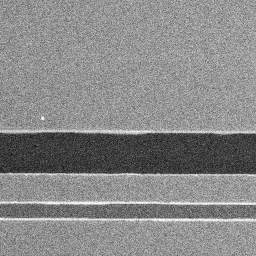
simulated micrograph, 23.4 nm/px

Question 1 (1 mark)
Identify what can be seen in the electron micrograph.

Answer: lines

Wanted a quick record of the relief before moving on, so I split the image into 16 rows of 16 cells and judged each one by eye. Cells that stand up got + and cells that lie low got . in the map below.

++++++++++++++++
++++++++++++++++
++++++++++++++++
++++++++++++++++
++++++++++++++++
++++++++++++++++
++++++++++++++++
++++++++++++++++
................
................
................
++++++++++++++++
++++++++++++++++
++++++++++++++++
++++++++++++++++
++++++++++++++++